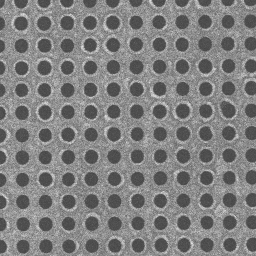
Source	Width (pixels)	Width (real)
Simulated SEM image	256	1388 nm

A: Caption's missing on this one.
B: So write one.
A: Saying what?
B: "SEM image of a regular array of holes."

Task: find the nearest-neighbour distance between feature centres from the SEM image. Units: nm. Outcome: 120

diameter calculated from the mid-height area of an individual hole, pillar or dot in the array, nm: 74